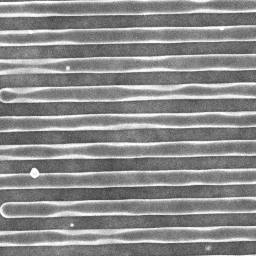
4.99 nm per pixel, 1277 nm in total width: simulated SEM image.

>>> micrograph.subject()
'groups of lines, slits or small figures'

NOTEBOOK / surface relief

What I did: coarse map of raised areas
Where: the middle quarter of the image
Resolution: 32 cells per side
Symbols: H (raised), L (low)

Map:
HHHHHHHHHHHHHHHHHHHHHHHHHHHHHHHH
HHHHHHHHHHHHHHHHHHHHLLLLLLLHHHHH
LLLLLLLLLLLLLLLLLLLLLLLLLLLLLLLL
LLLLLLLLLLLLLLLLLLLLLLLLLLLLLLLL
LLLLLLLLLLLLLLLLLLLLLLLLLLLLLLLL
LLLLLLLLLLLLLLLLLLLLLLLLLLLLLHHH
HHHHHHHHHHHHHHHHHHHHHHHHHHHHHHHH
HHHHHHHHHHHHHHHHHHHHHHHHHHHHHHHH
HHHHHHHHHHHHHHHHHHHHHHHHLLLLLLLL
LLLLLLLLLLLLLLLLLLLLLLLLLLLLLLLL
LLLLLLLLLLLLLLLLLLLLLLLLLLLLLLLL
LLLLLLLLLLLLLLLLLLLLLLLLLLLLLLLL
LLLLLLLLLLLLLLLLLLLLLLLLLLLLLLLL
HHHHHHHHHHHHHHHHHHHHHHHHHHHHHHHH
HHHHHHHHHHHHHHHHHHHHHHHHHHHHHHHH
HHHHHHHHHHHHHHHHHHHLHHHHHHHHHHHH
LLLLLLLLLLLLLLLLLLLLLLLLLLLLLLLL
LLLLLLLLLLLLLLLLLLLLLLLLLLLLLLLL
LLLLLLLLLLLLLLLLLLLLLLLLLLLLLLLL
LLLLLLLLLLLLLLLLLLLLLLLLLLLLHHHH
LHHHHHHHHHHHHHHHHHHHHHHHHHHHHHHH
HHHHHHHHHHHHHHHHHHHHHHHHHHHHHHHH
HHHHHHHHHHHHHHHHHHHHHHHHHHHHHHHH
LLLLLLLLLLLLLLLLLLLLLLLLLLLLLLLL
LLLLLLLLLLLLLLLLLLLLLLLLLLLLLLLL
LLLLLLLLLLLLLLLLLLLLLLLLLLLLLLLL
LLLLLLLLLLLLLLLLLLLLLLLLLLLLLLLL
HLLLLHHHHHHHHHHHHHHHHHHHHHHHHHHH
HHHHHHHHHHHHHHHHHHHHHHHHHHHHHHHH
HHHHHHHHHHHHHHHHHHHHHHHHHHHHHHHH
HHHHHHHHHHHHHHHHHHHHLLLLLLLLLLLL
LLLLLLLLLLLLLLLLLLLLLLLLLLLLLLLL